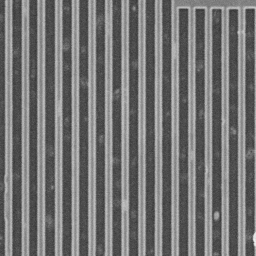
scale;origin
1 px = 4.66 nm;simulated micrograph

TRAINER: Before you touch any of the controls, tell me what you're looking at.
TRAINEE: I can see parallel lines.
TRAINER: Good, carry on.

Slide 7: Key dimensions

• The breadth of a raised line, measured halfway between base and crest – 25 nanometres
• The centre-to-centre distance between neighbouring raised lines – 77.5 nm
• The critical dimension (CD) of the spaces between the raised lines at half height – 53.5 nm